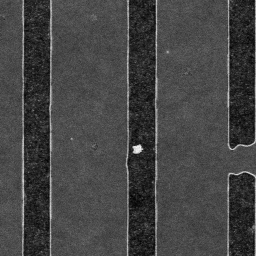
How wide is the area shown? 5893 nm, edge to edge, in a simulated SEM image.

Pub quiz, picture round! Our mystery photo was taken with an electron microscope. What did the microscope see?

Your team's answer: one or a few lines or trenches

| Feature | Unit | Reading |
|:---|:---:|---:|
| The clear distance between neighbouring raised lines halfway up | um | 1.77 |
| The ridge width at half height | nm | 639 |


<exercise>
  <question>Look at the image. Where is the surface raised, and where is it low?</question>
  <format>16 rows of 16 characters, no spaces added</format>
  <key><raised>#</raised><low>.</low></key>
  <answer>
.##.....##....##
.##.....##....##
.##.....##....##
.##.....##....##
.##.....##....##
.##.....##....##
.##.....##....##
.##.....##....##
.##.....##....##
.##.....##......
.##.....##......
.##.....##....##
.##.....##....##
.##.....##....##
.##.....##....##
.##.....##....##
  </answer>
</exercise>